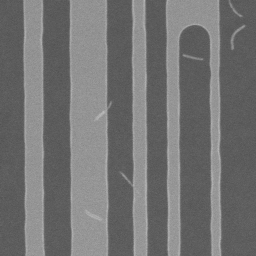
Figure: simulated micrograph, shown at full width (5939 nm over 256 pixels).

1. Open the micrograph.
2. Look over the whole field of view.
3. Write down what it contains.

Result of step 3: groups of lines, slits or small figures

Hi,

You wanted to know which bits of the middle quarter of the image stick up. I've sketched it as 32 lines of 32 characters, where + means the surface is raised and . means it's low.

..+++++++++......+++......+++...
..+++++++++......+++......+++...
..+++++++++......+++......+++...
..+++++++++......+++......+++...
..+++++++++......+++......+++...
..+++++++++......+++......+++...
..+++++++++......+++......+++...
..+++++++++......+++......+++...
..+++++++++......+++......+++...
..+++++++++......+++......+++...
..+++++++++......+++......+++...
..+++++++++......+++......+++...
..+++++++++......+++......+++...
..+++++++++......+++......+++...
..+++++++++......+++......+++...
..+++++++++......++++.....+++...
..+++++++++......++++.....+++...
..+++++++++......++++.....+++...
..+++++++++......++++.....+++...
..+++++++++......++++.....+++...
..+++++++++......++++.....+++...
..+++++++++......++++.....+++...
..+++++++++......++++.....+++...
..+++++++++......++++.....+++...
..+++++++++.......+++.....+++...
..++++++++........+++.....+++...
..+++++++++.......++......+++...
..+++++++++.......++......+++...
..+++++++++.......++......+++...
..+++++++++......++++.....+++...
..+++++++++......++++.....+++...
..+++++++++.......++......+++...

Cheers